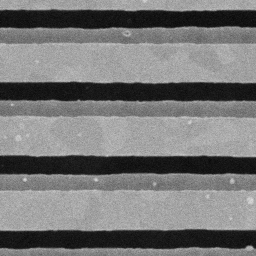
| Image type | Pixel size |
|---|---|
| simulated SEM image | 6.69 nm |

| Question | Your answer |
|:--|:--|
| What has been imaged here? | lines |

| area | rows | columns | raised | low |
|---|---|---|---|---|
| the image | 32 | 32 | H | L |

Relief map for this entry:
HHHHHHHHHHHHHHHHHHHHHHHHHHHHHHHH
LLLLLLLLLLLLLLLLLLLLLLLLLLLLLLLL
LLLLLLLLLLLLLLLLLLLLLLLLLLLLLLLL
LLLLLLLLLLLLLLLLLLLLLLHHHLLHHHLL
HHHHHHHHHHHHHHHHHHHHHHHHHHHHHHHH
HHHHHHHHHHHHHHHHHHHHHHHHHHHHHHHH
HHHHHHHHHHHHHHHHHHHHHHHHHHHHHHHH
HHHHHHHHHHHHHHHHHHHHHHHHHHHHHHHH
HHHHHHHHHHHHHHHHHHHHHHHHHHHHHHHH
HHHHHHHHHHHHHHHHHHHHHHHHHHHHHHHH
LLLLLLLLLLLLLLLLLLLLLLLLLLLLLLLL
LLLLLLLLLLLLLLLLLLLLLLLLLLLLLLLL
LLLLLLLLLLLLLLLLLLLLLLLLLLLLLLLL
HHHHHHHHHHHHHHHHHHHHHHHHHHHHHHHH
HHHHHHHHHHHHHHHHHHHHHHHHHHHHHHHH
HHHHHHHHHHHHHHHHHHHHHHHHHHHHHHHH
HHHHHHHHHHHHHHHHHHHHHHHHHHHHHHHH
HHHHHHHHHHHHHHHHHHHHHHHHHHHHHHHH
HHHHHHHHHHHHHHHHHHHHHHHHHHHHHHHH
LLLLHLLLLLLLLHLLLLLLLLLLLLLLHHHH
LLLLLLLLLLLLLLLLLLLLLLLLLLLLLLLL
LLLLLLLLLLLLLLLLLLLLLLLLLLLLLLLL
HHHHHHHHHHHHHHHHHHHHHHHHHHHHHHHH
HHHHHHHHHHHHHHHHHHHHHHHHHHHHHHHH
HHHHHHHHHHHHHHHHHHHHHHHHHHHHHHHH
HHHHHHHHHHHHHHHHHHHHHHHHHHHHHHHH
HHHHHHHHHHHHHHHHHHHHHHHHHHHHHHHH
HHHHHHHHHHHHHHHHHHHHHHHHHHHHHHHH
HHHHHHHHHHHHHHHHHHHHHHHHHHHHHHHH
LLLLLLLLLLLLLLLLLLLLLLLLLLLLLLLL
LLLLLLLLLLLLLLLLLLLLLLLLLLLLLLLL
HHHHHHHHHHHHHHHHHHHHHHHHHHHHHHHH